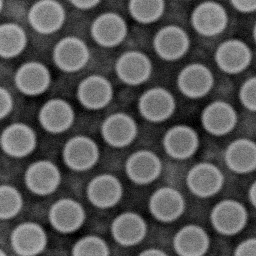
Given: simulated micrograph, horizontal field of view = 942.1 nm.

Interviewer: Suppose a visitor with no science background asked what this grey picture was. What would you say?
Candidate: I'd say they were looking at a regular array of raised bodies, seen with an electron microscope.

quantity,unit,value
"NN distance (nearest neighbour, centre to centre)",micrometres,0.164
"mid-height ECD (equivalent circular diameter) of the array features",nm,119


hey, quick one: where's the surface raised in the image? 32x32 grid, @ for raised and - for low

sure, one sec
-----@@--@@@----@@@@-----@@--@@@
----@@@@--------@@@@----@@@@----
----@@@@----@@@--@@-----@@@@----
@@--@@@-----@@@@-----@--@@@@----
@@@---------@@@-----@@@---------
@@@----@@@---@@----@@@@-----@@--
@@-----@@@@---------@@@----@@@@-
-------@@@@----@@@---------@@@@-
---@@---@@-----@@@@----@@@--@@--
--@@@@---------@@@----@@@@------
--@@@@----@@@@--------@@@@-----@
@--@@-----@@@@----@@@--@@@----@@
@---------@@@@----@@@@--------@@
@----@@@@---------@@@@----@@@--@
-----@@@@-----@@--@@@----@@@@---
-----@@@@----@@@@--------@@@@---
-@@@---------@@@@----@@@--@@----
@@@@-----@@--@@@-----@@@@-------
@@@@----@@@@---------@@@-----@@@
--------@@@@-----@@---@-----@@@@
----@@--@@@@----@@@@--------@@@@
---@@@@---------@@@@----@@@-----
---@@@@-----@@---@@----@@@@@----
@---@@@----@@@@---------@@@----@
@@---------@@@@----@@@@--------@
@@@----@@@--@@-----@@@@----@@@--
@@----@@@@---------@@@@----@@@@-
------@@@@-----@@@--@------@@@@-
--@@@--@@@----@@@@-----@@--@@@--
--@@@@--------@@@@----@@@@------
--@@@@----@@@--@@-----@@@@----@@
--@@@----@@@@-----@@--@@@@----@@